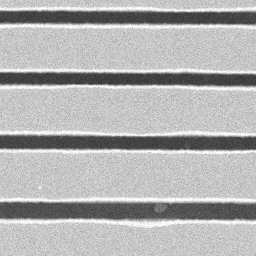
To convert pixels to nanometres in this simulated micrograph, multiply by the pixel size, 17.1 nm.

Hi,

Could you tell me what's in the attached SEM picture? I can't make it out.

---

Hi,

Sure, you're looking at lines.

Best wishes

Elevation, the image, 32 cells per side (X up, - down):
XXXXXXXXXXXXXXXXXXXXXXXXXXXXXXXX
--------------------------------
--------------------------------
XXXXXXXXXXXXXXXXXXXXXXXXXXXXXXXX
XXXXXXXXXXXXXXXXXXXXXXXXXXXXXXXX
XXXXXXXXXXXXXXXXXXXXXXXXXXXXXXXX
XXXXXXXXXXXXXXXXXXXXXXXXXXXXXXXX
XXXXXXXXXXXXXXXXXXXXXXXXXXXXXXXX
XXXXXXXXXXXXXXXXXXXXXXXXXXXXXXXX
--------------------------------
--------------------------------
XXXXXXXXXXXXXXXXXXXXXXXXXXXXXXXX
XXXXXXXXXXXXXXXXXXXXXXXXXXXXXXXX
XXXXXXXXXXXXXXXXXXXXXXXXXXXXXXXX
XXXXXXXXXXXXXXXXXXXXXXXXXXXXXXXX
XXXXXXXXXXXXXXXXXXXXXXXXXXXXXXXX
XXXXXXXXXXXXXXXXXXXXXXXXXXXXXXXX
--------------------------------
--------------------------------
XXXXXXXXXXXXXXXXXXXXXXXXXXXXXXXX
XXXXXXXXXXXXXXXXXXXXXXXXXXXXXXXX
XXXXXXXXXXXXXXXXXXXXXXXXXXXXXXXX
XXXXXXXXXXXXXXXXXXXXXXXXXXXXXXXX
XXXXXXXXXXXXXXXXXXXXXXXXXXXXXXXX
XXXXXXXXXXXXXXXXXXXXXXXXXXXXXXXX
--------------------------------
--------------------------------
XXXXXXXXXXXXXXXXX---XXXXXXXX-XX-
XXXXXXXXXXXXXXXXXXXXXXXXXXXXXXXX
XXXXXXXXXXXXXXXXXXXXXXXXXXXXXXXX
XXXXXXXXXXXXXXXXXXXXXXXXXXXXXXXX
XXXXXXXXXXXXXXXXXXXXXXXXXXXXXXXX